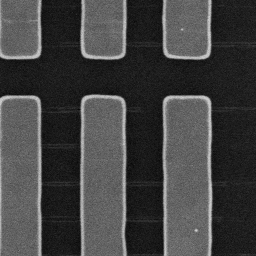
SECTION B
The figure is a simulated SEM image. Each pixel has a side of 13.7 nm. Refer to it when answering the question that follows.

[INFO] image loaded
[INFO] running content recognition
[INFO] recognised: wiring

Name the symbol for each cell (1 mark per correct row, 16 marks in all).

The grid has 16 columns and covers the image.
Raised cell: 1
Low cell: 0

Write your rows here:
1100011100111000
1100011100111000
1100011100111000
1100001000011000
0000000000000000
0000000000000000
1100011100111000
1100011100111000
1100011100111000
1100011100111000
1100011100111000
1100011100111000
1100011100111000
1100011100111000
1100011100111000
1100011100111000